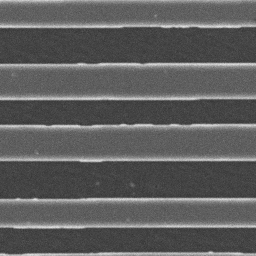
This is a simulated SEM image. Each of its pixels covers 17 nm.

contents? lines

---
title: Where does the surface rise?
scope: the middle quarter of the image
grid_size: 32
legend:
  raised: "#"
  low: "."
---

################################
################################
################################
################################
################################
################################
################################
################################
################################
................................
................................
................................
................................
................................
................................
####...#########################
################################
################################
################################
################################
################################
################################
################################
################################
................................
................................
................................
................................
................................
................................
................................
................................